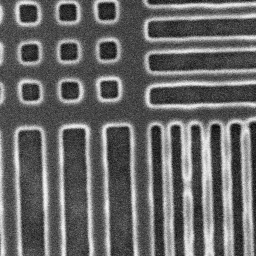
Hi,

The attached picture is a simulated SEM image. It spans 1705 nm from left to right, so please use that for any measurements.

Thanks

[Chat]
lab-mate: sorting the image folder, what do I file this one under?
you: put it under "groups of lines, slits or small figures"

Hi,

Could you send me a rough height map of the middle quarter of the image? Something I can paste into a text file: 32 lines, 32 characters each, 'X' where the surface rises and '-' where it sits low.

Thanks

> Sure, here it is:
XXXXXXXXXXXXXXXXXXXXX-----------
XXXXXXXXXXXXXXXXXXXXX-----------
XXXXXXXXXXXXXXXXXXXXXXXXXXXXXXXX
XXXXXXXXXXXXXXXXXXXXXXXXXXXXXXXX
---XXXXXX-----XXXXXXXXXXXXXXXXXX
----XXXXX-----XXXXXXXXX---------
----XXXXX-----XXXXXXX-----------
----XXXXX-----XXXXXXX-----------
----XXXXX-----XXXXXXX-----------
XXXXXXXXXXXXXXXXXXXXX-----------
XXXXXXXXXXXXXXXXXXXXXXXXXXXXXXXX
XXXXXXXXXXXXXXXXXXXXXXXXXXXXXXXX
XXXXXXXXXXXXXXXXXXXXXXXXXXXXXXXX
XXXXXXXXXXXXXXXXXXXXXXXXXXXXXXXX
XXXXXXXXXXXXXXXXXXXXXXXXXXXXXXXX
XXXXXXXXXXX-----XXXXXX--XXX--XXX
------XXXX-------XXXXX---X----X-
------XXXX-------XXXXX---X----X-
------XXXX-------XXXXX---XX---X-
------XXXX-------XXXXX---XX---X-
------XXXX-------XXXXX---XX---X-
------XXXX-------XXXXX---XX---X-
------XXXX-------XXXXX---XX---X-
------XXXX-------XXXXX---XX---X-
------XXXXX------XXXXX---XX---X-
------XXXXX------XXXXX---XX---X-
------XXXXX------XXXXX---XX---X-
------XXXXX------XXXXX---XX---X-
------XXXXX------XXXXX---XX---X-
------XXXXX------XXXXX---XX---X-
------XXXXX------XXXXX---XX-----
------XXXXX------XXXXX---XX---X-